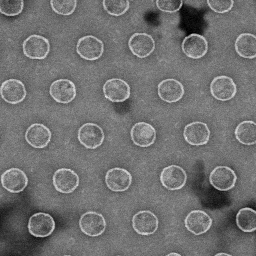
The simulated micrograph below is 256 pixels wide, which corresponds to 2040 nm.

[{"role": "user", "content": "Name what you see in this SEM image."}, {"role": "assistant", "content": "a regular array of raised bodies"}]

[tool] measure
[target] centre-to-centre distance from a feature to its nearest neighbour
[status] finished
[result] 0.401 um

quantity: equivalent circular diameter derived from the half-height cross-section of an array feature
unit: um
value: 0.192